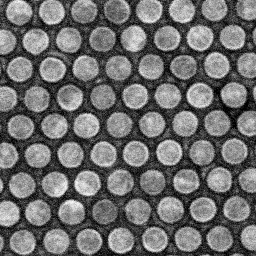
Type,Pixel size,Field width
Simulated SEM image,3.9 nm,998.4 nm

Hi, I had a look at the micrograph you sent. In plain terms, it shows a regular array of raised bodies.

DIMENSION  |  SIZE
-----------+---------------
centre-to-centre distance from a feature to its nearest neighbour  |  32.4 pixels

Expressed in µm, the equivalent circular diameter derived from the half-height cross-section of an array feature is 0.0955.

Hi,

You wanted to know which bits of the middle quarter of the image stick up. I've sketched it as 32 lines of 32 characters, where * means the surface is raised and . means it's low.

..******..*******..******..*****
..******..*******..******..*****
...*****...*****...*****...*****
...****.....***......**......**.
................................
***......**......**.....****....
****....****...*****...******..*
****...*****...******..******..*
****...******..******..******..*
****...******..******..******..*
****....***.....****.....***....
................................
.............**......**.....****
...*****...*****....****....****
*..*****...******..******..*****
*..******..******..******..*****
*..*****...*****....*****...****
...*****....****....****.....***
................................
.........*...............**.....
****....****....****....*****...
*****..******..******..******...
*****..******..******..******..*
*****..******..******...*****...
****....****....****....****....
***.............................
..............................*.
....***.....****....****....****
...*****...******..******...****
*..******..******..******...****
*..******..******..******...****
...******...*****...*****...****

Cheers